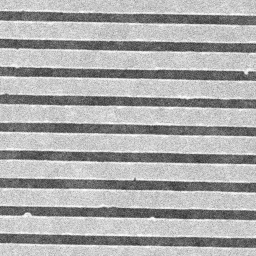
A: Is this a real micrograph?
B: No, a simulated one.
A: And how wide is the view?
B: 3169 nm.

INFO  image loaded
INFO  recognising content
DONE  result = parallel lines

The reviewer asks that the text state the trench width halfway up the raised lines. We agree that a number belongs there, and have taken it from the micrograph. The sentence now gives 132 nanometres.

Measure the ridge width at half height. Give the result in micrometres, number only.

0.215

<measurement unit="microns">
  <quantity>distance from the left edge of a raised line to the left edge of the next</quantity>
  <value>0.344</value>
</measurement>